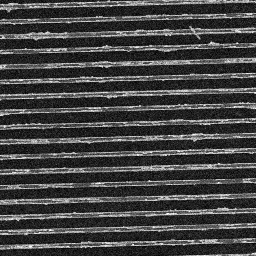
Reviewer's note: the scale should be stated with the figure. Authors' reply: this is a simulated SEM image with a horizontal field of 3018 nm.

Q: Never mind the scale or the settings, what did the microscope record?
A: parallel lines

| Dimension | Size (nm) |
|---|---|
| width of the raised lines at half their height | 53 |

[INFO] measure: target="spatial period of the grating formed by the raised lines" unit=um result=0.177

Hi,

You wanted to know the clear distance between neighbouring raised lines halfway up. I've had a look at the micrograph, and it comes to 0.128 µm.